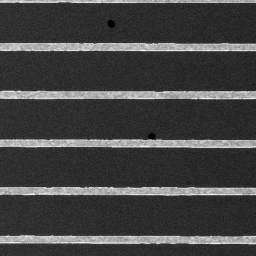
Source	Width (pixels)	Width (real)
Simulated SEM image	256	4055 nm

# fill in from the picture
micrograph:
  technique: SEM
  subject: lines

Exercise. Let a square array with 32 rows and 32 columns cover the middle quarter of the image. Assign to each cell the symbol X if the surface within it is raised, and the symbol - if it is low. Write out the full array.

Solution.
--------------------------------
--------------------------------
--------------------------------
--------------------------------
--------------------------------
--------------------------------
--------------------------------
XXXXXXXXXXXXXXXXXXXXXXXXXXXXXXXX
XXXXXXXXXXXXXXXXXXXXXXXXXXXXXXXX
--------------------------------
--------------------------------
--------------------------------
--------------------------------
--------------------------------
--------------------------------
--------------------------------
--------------------------------
--------------------------------
--------------------------------
XXXXXXXXXXXXXXXXXXXXXXXXXXXXXXXX
XXXXXXXXXXXXXXXXXXXXXXXXXXXXXXXX
--------------------------------
--------------------------------
--------------------------------
--------------------------------
--------------------------------
--------------------------------
--------------------------------
--------------------------------
--------------------------------
--------------------------------
XXXXXXXXXXXXXXXXXXXXXXXXXXXXXXXX